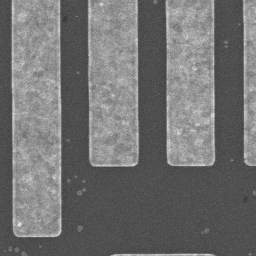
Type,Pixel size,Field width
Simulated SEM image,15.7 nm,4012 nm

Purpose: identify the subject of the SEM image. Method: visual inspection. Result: wiring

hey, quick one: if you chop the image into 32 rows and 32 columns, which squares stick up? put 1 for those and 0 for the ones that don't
00111110000111111000011111100011
00111110000111111000011111100011
00111110000111111000011111100011
00111110000111111000011111100001
00111110000111111000011111100001
00111110000111111000011111100001
00111110000111111000011111100001
00111110000111111000011111100001
00111110000111111000011111100001
00111110000111111000011111100001
00111110000111111000011111100001
00111110000111111000011111100001
00111111000111111000011111100001
00111111000111111000011111100001
00111111000111111000011111100001
00111111000111111000011111100001
00111111000111111000011111100001
00111111000111111000011111100001
00111111000111111000011111100001
00111111000111111000011111100001
00111111000111111000011111000001
00111111000000000000000000000000
00111111000000000000000000000000
00111111000000000000000000000000
00111111000000000000000000000000
00111111000000000000000000000000
00111111000000000000000000000000
00111111000000000000000000000000
00111111000000000000000000000000
00111110000000000000000000000000
00000000000000000000000000000000
00000000000000000000000000000000